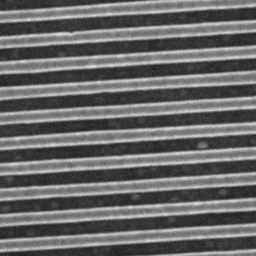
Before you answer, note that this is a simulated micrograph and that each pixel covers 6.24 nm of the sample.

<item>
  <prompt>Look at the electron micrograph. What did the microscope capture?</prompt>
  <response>parallel lines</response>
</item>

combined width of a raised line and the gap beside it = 0.158 µm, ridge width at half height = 64.6 nm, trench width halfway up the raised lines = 96.5 nm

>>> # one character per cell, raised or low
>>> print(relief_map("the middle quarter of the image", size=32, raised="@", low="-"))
@@@@@@@@@@@---------------------
--------------------------------
--------------------------------
-------------------------@@@@@@@
---------@@@@@@@@@@@@@@@@@@@@@@@
@@@@@@@@@@@@@@@@@@@@@@@@@@@@@@@-
@@@@@@@@@@@@@@@-----------------
--------------------------------
--------------------------------
------------------------------@@
-----------------@@@@@@@@@@@@@@@
@@@@@@@@@@@@@@@@@@@@@@@@@@@@@@@@
@@@@@@@@@@@@@@@@@@@@@@@---------
@@@@@@@-------------------------
--------------------------------
--------------------------------
-----------------@@--@@@@@@@@@@@
--@@@@@@@@@@@@@@@@@@@@@@@@@@@@@@
@@@@@@@@@@@@@@@@@@@@@@@@@@@-----
@@@@@@@@@@@---------------------
--------------------------------
--------------------------------
-------------------------@@@@@@@
---------@@@@@@@@@@@@@@@@@@@@@@@
@@@@@@@@@@@@@@@@@@@@@@@@@@@@@@@@
@@@@@@@@@@@@@@@@----------------
--------------------------------
--------------------------------
-----------------------------@@@
-----------------@@@@@@@@@@@@@@@
-@@@@@@@@@@@@@@@@@@@@@@@@@@@@@@@
@@@@@@@@@@@@@@@@@@@@@@@---------